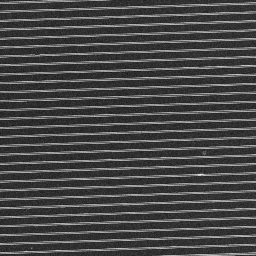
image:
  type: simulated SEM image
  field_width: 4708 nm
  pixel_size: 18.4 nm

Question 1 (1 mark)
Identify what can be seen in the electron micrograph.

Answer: parallel lines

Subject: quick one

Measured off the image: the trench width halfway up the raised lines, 126 nm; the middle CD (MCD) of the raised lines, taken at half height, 0.0345 micrometres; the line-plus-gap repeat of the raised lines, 164 nanometers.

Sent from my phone